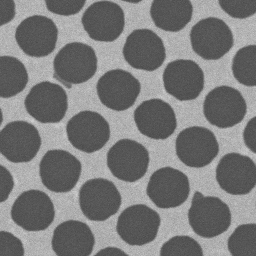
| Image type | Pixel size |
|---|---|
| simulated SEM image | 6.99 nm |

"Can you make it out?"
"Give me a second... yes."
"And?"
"a regular array of holes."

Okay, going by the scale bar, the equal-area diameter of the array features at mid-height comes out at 297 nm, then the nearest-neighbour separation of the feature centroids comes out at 335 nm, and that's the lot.